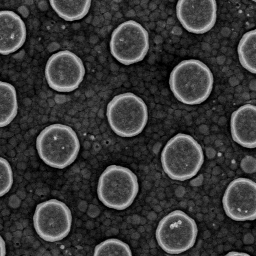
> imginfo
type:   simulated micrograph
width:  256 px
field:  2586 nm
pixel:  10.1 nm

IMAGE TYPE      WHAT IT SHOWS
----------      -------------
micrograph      a regular array of raised bodies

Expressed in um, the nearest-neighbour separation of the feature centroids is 0.722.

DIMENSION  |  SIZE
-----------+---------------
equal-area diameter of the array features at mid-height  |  0.399 micrometres